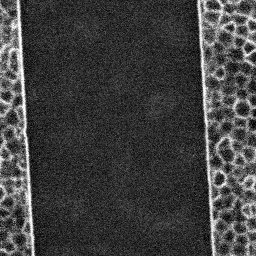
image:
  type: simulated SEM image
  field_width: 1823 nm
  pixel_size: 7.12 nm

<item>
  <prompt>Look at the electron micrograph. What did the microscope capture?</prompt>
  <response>one or a few lines or trenches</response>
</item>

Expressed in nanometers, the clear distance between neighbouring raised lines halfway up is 1280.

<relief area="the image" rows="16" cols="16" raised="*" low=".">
*...........****
*............***
*............***
*............***
*............***
*............***
**...........***
**...........***
**...........***
**...........***
**...........***
**...........***
**...........***
**...........***
**...........***
**...........***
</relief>